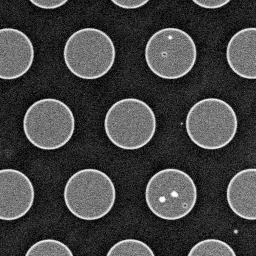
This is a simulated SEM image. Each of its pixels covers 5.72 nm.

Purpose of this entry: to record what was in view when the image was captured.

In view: an array of small figures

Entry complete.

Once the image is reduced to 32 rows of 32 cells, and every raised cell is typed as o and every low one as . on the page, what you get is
....oooo.......ooo.......ooo....
................................
................................
................................
ooo......oooo......ooooo.....ooo
oooo....oooooo....oooooo.....ooo
oooo....oooooo....oooooo....oooo
oooo....oooooo....oooooo....oooo
oooo.....ooooo.....ooooo.....ooo
ooo.......oo........ooo.......oo
................................
................................
.....oo.........o.........o.....
....oooo......ooooo.....ooooo...
...oooooo....oooooo....oooooo...
...oooooo....oooooo....ooooooo..
...oooooo....oooooo....oooooo...
....ooooo.....ooooo.....ooooo...
.....oo........oo...............
................................
................................
oo........ooo.......ooo.......oo
oooo.....ooooo.....ooooo.....ooo
oooo....oooooo....oooooo....oooo
oooo....oooooo....oooooo....oooo
oooo....oooooo....oooooo.....ooo
ooo......oooo......ooooo.....ooo
................................
................................
................................
.....ooo.......ooo.......ooo....
...oooooo.....ooooo.....ooooo...